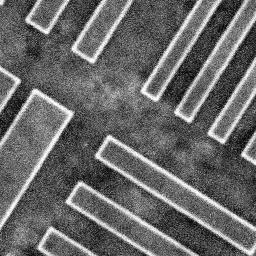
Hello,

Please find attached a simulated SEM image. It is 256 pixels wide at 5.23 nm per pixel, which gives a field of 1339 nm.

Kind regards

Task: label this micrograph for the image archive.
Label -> groups of lines, slits or small figures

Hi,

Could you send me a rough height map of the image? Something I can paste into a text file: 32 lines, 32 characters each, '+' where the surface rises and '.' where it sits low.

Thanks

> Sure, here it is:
.....+++.....+++.........++...++
....++++....++++........+++...++
...++++....++++........+++...+++
.....+.....+++.........++...+++.
..........++++........+++...+++.
.........++++........+++...+++..
.........+++.........++....++...
...........+........+++...+++...
...................+++...+++...+
++.................+++...++....+
++................+++...+++...++
++..+.............++...+++...+++
+..+++.................++....++.
...+++++..............+++...+++.
..+++++++.............++...+++..
..++++++...................++...
.+++++++..................+++...
+++++++......+.............+...+
++++++.......+++...............+
++++++......++++++............++
+++++........++++++.............
++++...........++++++...........
++++............++++++..........
+++......++.......++++++........
+++......++++.......++++++......
++.......+++++.......++++++.....
+.........++++++.......++++++...
+...........++++++......++++++..
.............++++++.......++++++
......++.......++++++.......++++
.....+++++......++++++.......+++
.....++++++.......++++++.......+